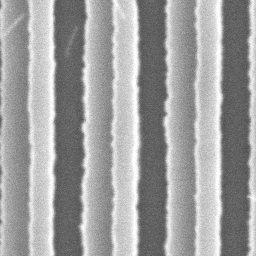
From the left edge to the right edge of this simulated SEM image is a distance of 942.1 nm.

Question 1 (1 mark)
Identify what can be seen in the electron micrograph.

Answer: lines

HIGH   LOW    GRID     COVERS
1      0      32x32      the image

11111110000111111000011111100000
11111100000111111000011111100001
11111110000111111000011111100001
11111110000111111000011111110000
11111100000111111000011111110001
11111110000111111000011111100001
11111110000111111000011111100001
11111110000111111000011111100001
11111110000111111000011111100001
11111110000111111000011111100001
11111110000111111000011111100001
11111110000111111000011111100001
11111110000111111000011111110001
11111110000111111000011111100001
11111110000111111000011111100001
11111110000111111000011111100001
11111110000111111000011111100001
11111110000111111000011111100001
11111110000111111000011111100000
11111110000111111000011111100001
11111110000111111000011111100001
11111100000111111000011111100001
11111110000111111000011111100001
11111110001111111000011111100001
11111100001111111000011111100001
11111100000111111000011111100001
11111100000111111000011111110001
11111100000111111000011111100001
11111100001111111000011111100001
11111100000111111000011111100001
11111100000111111000011111100001
11111110000111111000011111100001